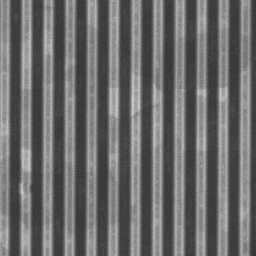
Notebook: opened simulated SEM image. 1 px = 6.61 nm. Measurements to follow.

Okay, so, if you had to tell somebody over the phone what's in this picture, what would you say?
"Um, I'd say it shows parallel lines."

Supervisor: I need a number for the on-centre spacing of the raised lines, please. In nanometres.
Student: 145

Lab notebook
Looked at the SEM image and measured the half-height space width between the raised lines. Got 0.0752 microns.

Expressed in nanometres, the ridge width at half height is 68.6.